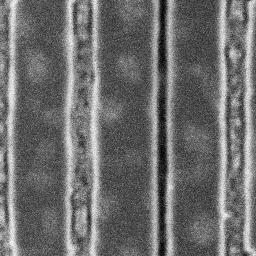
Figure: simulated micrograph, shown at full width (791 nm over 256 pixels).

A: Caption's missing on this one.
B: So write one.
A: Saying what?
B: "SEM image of one or a few lines or trenches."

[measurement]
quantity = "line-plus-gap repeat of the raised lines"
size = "0.24 um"